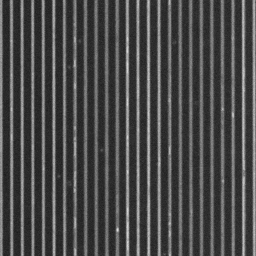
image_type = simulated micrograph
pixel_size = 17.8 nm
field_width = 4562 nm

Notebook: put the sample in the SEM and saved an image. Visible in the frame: parallel lines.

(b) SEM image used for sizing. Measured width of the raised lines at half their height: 33.4 nm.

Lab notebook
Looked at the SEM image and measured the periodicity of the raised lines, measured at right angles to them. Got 188 nm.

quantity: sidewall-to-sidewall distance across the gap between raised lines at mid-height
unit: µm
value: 0.156